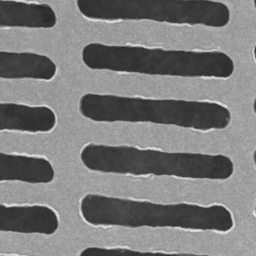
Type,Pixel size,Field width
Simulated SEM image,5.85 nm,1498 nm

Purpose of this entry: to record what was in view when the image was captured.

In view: holes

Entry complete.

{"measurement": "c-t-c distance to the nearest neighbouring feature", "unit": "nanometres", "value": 296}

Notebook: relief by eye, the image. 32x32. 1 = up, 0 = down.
00000011110000000000000000001111
00000001110000000000000000000111
00000001111111110110000000000111
11111111111111111111111111111111
11111111111111111111111111111111
11111111111111111111111111111111
01111111110000000000000011011111
00000011110000000000000000000111
00000001111000000000000000000111
00000001111111111111110000001111
11111111111111111111111111111111
11111111111111111111111111111111
11111111110000000001011111111111
00000011110000000000000000001111
00000001111000000000000000000111
00000001111111111111000000001111
11111111111111111111111111111111
11111111111111111111111111111111
11111111111000000111111111111111
00011111110000000000000000001111
00000011111000000000000000000111
00000001111110000000000000000111
00000011111111111111111111111111
11111111111111111111111111111111
11111111111001111111111111111111
11111111110000000000111111111111
00000001110000000000000000000111
00000001111000000000000000000111
00000001111111111111111000000111
11111111111111111111111111111111
11111111111111111111111111111111
11111111110000000111111111111111